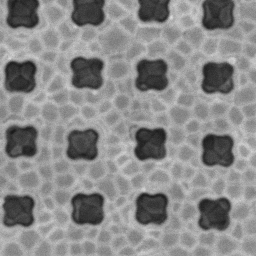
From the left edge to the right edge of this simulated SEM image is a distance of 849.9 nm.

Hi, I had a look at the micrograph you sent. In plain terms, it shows a regular array of holes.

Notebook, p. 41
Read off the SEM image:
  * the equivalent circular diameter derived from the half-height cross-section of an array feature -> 121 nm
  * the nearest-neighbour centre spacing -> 213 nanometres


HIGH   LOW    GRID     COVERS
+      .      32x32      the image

+....++++....++++....++++....+++
+....++++....++++....++++....+++
+....++++....++++....++++....+++
+...+++++++++++++++++++++....+++
++++++++++++++++++++++++++++++++
++++++++++++++++++++++++++++++++
++++++++++++++++++++++++++++++++
+++.+++++....++++....+++++++++++
.....++++....++++....++++....+++
+....++++....++++....++++....+++
.....++++....++++....++++....+++
+...+++++++++++++++++++++....+++
++++++++++++++++++++++++++++++++
++++++++++++++++++++++++++++++++
++++++++++++++++++++++++++++++++
++++++++++++++++++++++++++++++++
+....++++...+++++....+++++++++++
+....+++....+++++....++++....+++
+....+++....+++++....++++....+++
+...++++....+++++....++++....+++
+++++++++++++++++++++++++....+++
++++++++++++++++++++++++++++++++
++++++++++++++++++++++++++++++++
++++++++++++++++++++++++++++++++
+...+++++....++++....+++++++++++
....+++++....++++....++++....+++
....+++++....++++....++++....+++
....+++++....++++....++++....+++
+++++++++++++++++++++++++...++++
++++++++++++++++++++++++++++++++
++++++++++++++++++++++++++++++++
++++++++++++++++++++++++++++++++